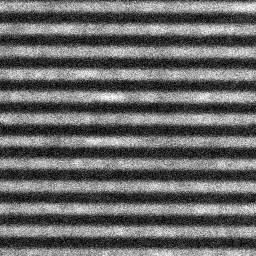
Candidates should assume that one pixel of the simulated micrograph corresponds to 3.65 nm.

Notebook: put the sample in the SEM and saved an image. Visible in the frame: parallel lines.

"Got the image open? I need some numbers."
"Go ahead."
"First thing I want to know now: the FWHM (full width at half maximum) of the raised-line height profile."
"33.3 nm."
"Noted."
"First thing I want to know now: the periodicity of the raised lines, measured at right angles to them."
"0.082 µm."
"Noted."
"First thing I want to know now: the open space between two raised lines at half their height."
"0.0497 µm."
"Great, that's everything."